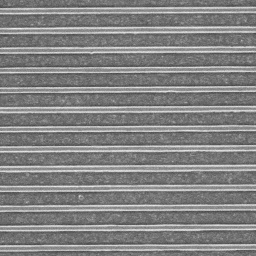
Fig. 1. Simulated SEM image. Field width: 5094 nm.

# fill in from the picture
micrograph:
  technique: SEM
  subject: parallel lines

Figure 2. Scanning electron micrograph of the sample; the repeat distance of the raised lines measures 393 nm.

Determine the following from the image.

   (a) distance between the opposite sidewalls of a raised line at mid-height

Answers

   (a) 99.5 nm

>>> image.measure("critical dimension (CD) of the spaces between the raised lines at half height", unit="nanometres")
294